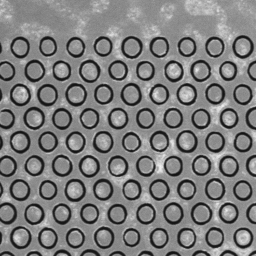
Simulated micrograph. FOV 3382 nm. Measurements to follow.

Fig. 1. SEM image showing a regular array of ring-shaped grooves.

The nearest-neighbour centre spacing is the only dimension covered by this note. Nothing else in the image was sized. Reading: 364 nm